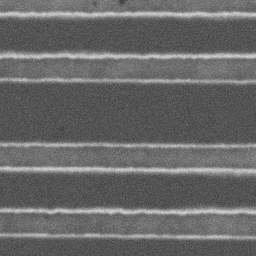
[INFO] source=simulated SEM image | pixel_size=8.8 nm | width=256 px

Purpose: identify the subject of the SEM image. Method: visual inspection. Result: lines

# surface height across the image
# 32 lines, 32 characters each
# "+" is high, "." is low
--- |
................................
................................
++++++++++++++++++++++++++++++++
++++++++++++++++++++++++++++++++
++++++++++++++++++++++++++++++++
++++++++++++++++++++++++++++++++
++++++++++++++++++++++++++++++++
................................
................................
................................
++++++++++++++++++++++++++++++++
++++++++++++++++++++++++++++++++
++++++++++++++++++++++++++++++++
++++++++++++++++++++++++++++++++
++++++++++++++++++++++++++++++++
++++++++++++++++++++++++++++++++
++++++++++++++++++++++++++++++++
++++++++++++++++++++++++++++++++
................................
................................
................................
++++++++++++++++++++++++++++++++
++++++++++++++++++++++++++++++++
++++++++++++++++++++++++++++++++
++++++++++++++++++++++++++++++++
++++++++++++++++++++++++++++++++
.....++.++++++++++++++++++++++++
................................
................................
+++++++++++++++.++++++..........
++++++++++++++++++++++++++++++++
++++++++++++++++++++++++++++++++